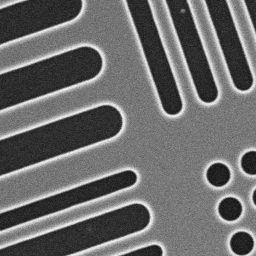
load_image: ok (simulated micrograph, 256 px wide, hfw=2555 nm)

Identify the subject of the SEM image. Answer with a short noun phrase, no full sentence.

groups of lines, slits or small figures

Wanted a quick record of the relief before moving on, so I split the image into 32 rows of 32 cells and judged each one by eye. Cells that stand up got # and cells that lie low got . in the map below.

##........######...##...##..###.
..........######...##...##...##.
.........#######...##...##...##.
......###########...##...##...##
...##############...##...##...##
##################..###..##...##
########....######...##...##...#
#####........#####...##...##...#
##...........######..##...##...#
............#######...##...##...
..........#########...##...##...
.......#############..###..#####
....################...##..#####
.###########..######...#########
#########......#################
######.........#################
###............#################
.............###################
..........######################
.......#######################..
....#######################.##..
..#############..#########...##.
############.....#########...###
#########.......################
######.......###################
###.......######..#########...##
#......#######.....########...##
....######.........#########.###
.#######..........##############
#####...........#############..#
##...........################...
..........######....#########..#